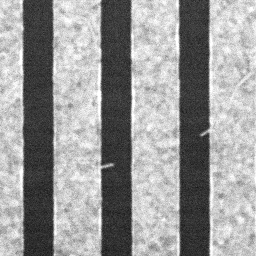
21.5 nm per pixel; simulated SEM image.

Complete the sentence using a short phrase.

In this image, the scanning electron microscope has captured wiring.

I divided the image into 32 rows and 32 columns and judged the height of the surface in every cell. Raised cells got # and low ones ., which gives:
###....#####.....#####....######
###....#####.....#####....######
###....#####.....#####....######
###....#####.....#####....######
###....#####.....#####....######
###....#####.....#####....######
###....#####.....#####....######
###....#####.....#####....######
###....#####.....#####....######
###....#####.....#####....######
###....#####.....#####....######
###....#####.....#####....######
###....#####.....#####....######
###....#####.....#####....######
###....#####.....#####....######
###....######....#####....######
###....######....#####....######
###....#####.....#####....######
###....#####.....#####....######
###....#####.....#####....######
###....######....#####....######
###....#####.....#####....######
###....#####.....#####....######
###....#####.....#####.....#####
###....######....#####....######
###....######....#####....######
###....#####.....#####....######
###....#####.....#####....######
###....#####.....#####....######
###....######....#####....######
###....######....#####....######
###....######....#####....######